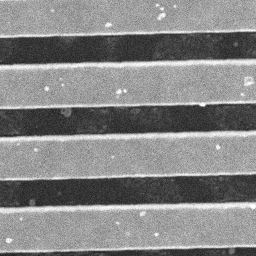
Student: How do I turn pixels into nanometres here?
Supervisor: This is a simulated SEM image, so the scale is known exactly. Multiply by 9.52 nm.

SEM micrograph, lines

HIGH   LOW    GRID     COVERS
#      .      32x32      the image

################################
################################
################################
################################
#######.........................
................................
................................
...............................#
################################
################################
################################
################################
################################
####............................
................................
................................
..........................######
################################
################################
################################
################################
################################
................................
................................
................................
......................##########
################################
################################
################################
################################
################################
#...............................